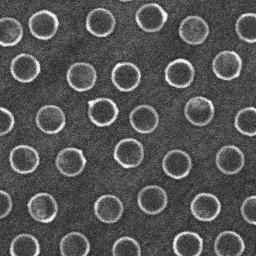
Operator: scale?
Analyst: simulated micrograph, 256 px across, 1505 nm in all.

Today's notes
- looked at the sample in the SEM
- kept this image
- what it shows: a regular array of raised bodies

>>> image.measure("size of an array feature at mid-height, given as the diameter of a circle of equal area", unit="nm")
163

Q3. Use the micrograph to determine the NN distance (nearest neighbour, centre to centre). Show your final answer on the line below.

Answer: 262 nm